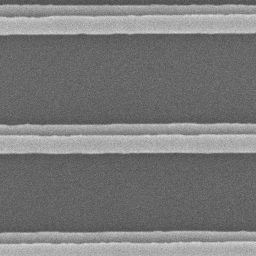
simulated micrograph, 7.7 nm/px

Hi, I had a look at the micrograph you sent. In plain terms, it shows lines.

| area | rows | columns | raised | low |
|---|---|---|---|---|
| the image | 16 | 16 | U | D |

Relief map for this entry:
UUUUUUUUUUUUUUUU
UUUUUUUUUUUUUUUU
DDDDDDDDDDDDDDDD
DDDDDDDDDDDDDDDD
DDDDDDDDDDDDDDDD
DDDDDDDDDDDDDDDD
DDDDDDDDDDDDDDDD
DDDDDDDDDDDDDDDD
UUUUUUUUUUUUUUUU
UUUUUUUUUUUUUUUU
DDDDDDDDDDDDDDDD
DDDDDDDDDDDDDDDD
DDDDDDDDDDDDDDDD
DDDDDDDDDDDDDDDD
DDDDDDDDDDDUDDDD
UUUUUUUUUUUUUUUU